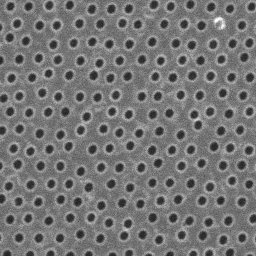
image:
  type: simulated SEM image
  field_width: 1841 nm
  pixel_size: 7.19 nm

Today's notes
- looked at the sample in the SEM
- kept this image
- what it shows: a regular array of holes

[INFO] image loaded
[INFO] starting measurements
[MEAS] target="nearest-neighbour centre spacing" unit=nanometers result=124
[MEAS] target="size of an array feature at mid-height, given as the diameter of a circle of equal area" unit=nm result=68.8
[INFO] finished